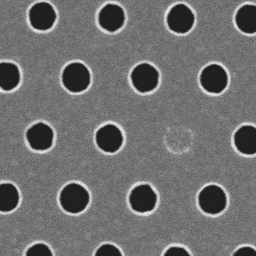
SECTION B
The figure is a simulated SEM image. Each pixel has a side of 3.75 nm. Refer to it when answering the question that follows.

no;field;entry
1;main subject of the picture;a regular array of holes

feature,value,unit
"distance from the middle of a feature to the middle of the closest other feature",258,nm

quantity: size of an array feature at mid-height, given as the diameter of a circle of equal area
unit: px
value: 27.5